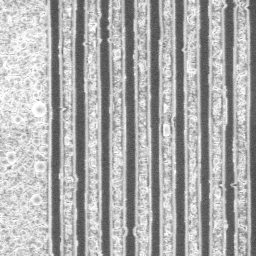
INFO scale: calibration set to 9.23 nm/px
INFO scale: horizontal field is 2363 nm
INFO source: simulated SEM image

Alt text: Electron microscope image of parallel lines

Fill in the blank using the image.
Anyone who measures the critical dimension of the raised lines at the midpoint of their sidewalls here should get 0.11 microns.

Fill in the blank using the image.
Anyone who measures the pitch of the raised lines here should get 0.229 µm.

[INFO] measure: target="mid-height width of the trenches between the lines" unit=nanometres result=119